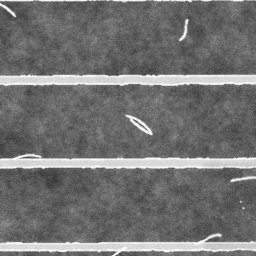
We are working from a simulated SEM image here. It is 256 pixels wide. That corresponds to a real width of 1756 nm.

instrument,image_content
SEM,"lines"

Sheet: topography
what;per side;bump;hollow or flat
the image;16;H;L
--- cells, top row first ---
LLLLLLLLLLLLLLLL
LLLLLLLLLLLLLLLL
LLLLLLLLLLLLLLLL
LLLLLLLLLLLLLLLL
LLLLLLLLLLLLLLLL
LLLLLLLLLLLLLLLL
LLLLLLLLLLLLLLLL
LLLLLLLLLLLLLLLL
LLLLLLLLLLLLLLLL
LLLLLLLLLLLLLLLL
LLLLLLLLLLLLLLLL
LLLLLLLLLLLLLLLL
LLLLLLLLLLLLLLLL
LLLLLLLLLLLLLLLL
LLLLLLLLLLLLLLLL
HHHHHLHHHHHHHHHH